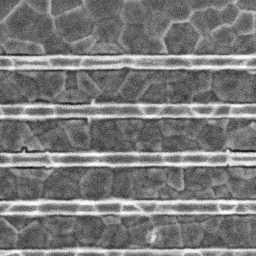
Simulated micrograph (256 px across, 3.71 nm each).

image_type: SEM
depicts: parallel lines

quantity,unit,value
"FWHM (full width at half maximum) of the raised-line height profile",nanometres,45.5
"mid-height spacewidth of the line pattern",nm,134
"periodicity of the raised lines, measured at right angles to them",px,48.5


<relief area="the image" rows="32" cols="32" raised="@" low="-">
--------------------------------
--------------------------------
--------------------------------
--------------------------------
--------------------------------
--------------------------------
--------------------------------
@@@@@@@@@@@@@@@@@@@@@@@@@@@@@@@@
@@@@@@@@@@@@@@---@@@@@@@@@---@-@
--------------------------------
--------------------------------
--------------------------------
--------------------------------
@@@@@@@@@@@@@@@@@@@@@@@@@@@@@@@@
@@@@@@@@@@@@@@@@@@@@@@@@@@@@@@@@
--------------------------------
--------------------------------
--------------------------------
--------------------------------
@@@@@@@@@@@@@@@@@@@@@@@@@@@@@@@@
@@@@@@@@@@@@@@@@@@@@@@@@@@@@@@@@
--------------------------------
--------------------------------
--------------------------------
--------------------------------
@@@@@@@@@@@@@@@@@@@@@@@@@@@@@@@@
@@@@@@@@@@@@@@@@@@@@@@@@@@@@@@@@
--------------------------------
--------------------------------
--------------------------------
--------------------------------
@@@@@@@@@@@@@@@@@@@@@@@@@@@@@@@@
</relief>